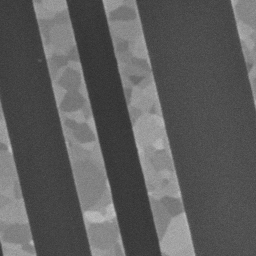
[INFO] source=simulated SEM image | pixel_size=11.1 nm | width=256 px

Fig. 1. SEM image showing lines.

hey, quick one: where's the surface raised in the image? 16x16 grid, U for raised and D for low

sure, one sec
DDUUDDDUUDDDDDDU
DDUUDDDUUDDDDDDU
DDDUUDDUUDDDDDDU
DDDUUDDUUDDDDDDU
DDDUUDDUUUDDDDDU
DDDUUDDDUUDDDDDD
DDDDUUDDUUDDDDDD
DDDDUUDDUUDDDDDD
UDDDUUDDUUDDDDDD
UDDDUUDDDUUDDDDD
UDDDUUUDDUUDDDDD
UDDDDUUDDUUDDDDD
UDDDDUUDDUUDDDDD
UUDDDUUDDDUUDDDD
UUDDDUUUDDUUDDDD
UUDDDDUUDDUUDDDD